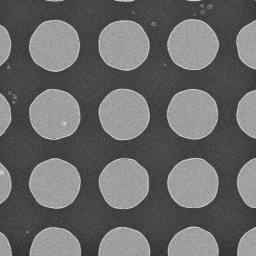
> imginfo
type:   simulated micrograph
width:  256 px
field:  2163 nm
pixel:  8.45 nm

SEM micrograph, an array of small figures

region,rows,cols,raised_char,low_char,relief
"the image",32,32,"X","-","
--------------------------------
--------------------------------
-----------------------XX-------
X----XXXX----XXXXX----XXXX----XX
X---XXXXXX--XXXXXX---XXXXXX---XX
X---XXXXXX--XXXXXXX--XXXXXX---XX
X---XXXXXX--XXXXXXX--XXXXXX---XX
X---XXXXX----XXXXX----XXXXX---XX
-----XXX------XXX------XX------X
--------------------------------
--------------------------------
-----XXX------XXX------XXX-----X
X---XXXXX----XXXXX---XXXXXX---XX
X---XXXXXX--XXXXXXX--XXXXXX---XX
X---XXXXXX--XXXXXXX--XXXXXX---XX
X---XXXXXX---XXXXXX--XXXXXX---XX
X----XXXX----XXXXX----XXXX-----X
---------------X----------------
--------------------------------
--------------------------------
-----XXXX-----XXX-----XXXX-----X
X---XXXXXX---XXXXX---XXXXXX---XX
X---XXXXXX--XXXXXXX--XXXXXX---XX
X---XXXXXX--XXXXXXX--XXXXXX---XX
X---XXXXXX---XXXXX---XXXXXX---XX
-----XXXX-----XXX-----XXXX-----X
--------------------------------
--------------------------------
------X--------X-------XX-------
X----XXXX----XXXXX----XXXXX---XX
X---XXXXXX---XXXXXX--XXXXXX---XX
X---XXXXXX--XXXXXXX--XXXXXX---XX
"